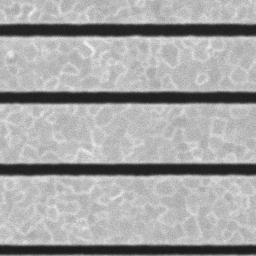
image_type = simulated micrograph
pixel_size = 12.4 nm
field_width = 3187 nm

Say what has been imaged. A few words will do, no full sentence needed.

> lines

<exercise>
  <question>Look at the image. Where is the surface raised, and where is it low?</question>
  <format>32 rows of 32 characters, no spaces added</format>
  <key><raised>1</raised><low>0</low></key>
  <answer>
11111111111111111111111111111111
11111111111111111111111111111111
11111111111111111111111111111111
00000000000000000000000000000000
00000000000000000000000000000000
11111111111111111111111111111111
11111111111111111111111111111111
11111111111111111111111111111111
11111111111111111111111111111111
11111111111111111111111111111111
11111111111111111111111111111111
00000000000000000000000000000000
00000000000000000000000000000000
11111111111111111111111111111111
11111111111111111111111111111111
11111111111111111111111111111111
11111111111111111111111111111111
11111111111111111111111111111111
11111111111111111111111111111111
11111111111111111111111111111111
00000000000000000000000000000000
00000000000000000000000000000000
11111111111111111111111111111111
11111111111111111111111111111111
11111111111111111111111111111111
11111111111111111111111111111111
11111111111111111111111111111111
11111111111111111111111111111111
11111111111111111111111111111111
11111111111111111111111111111111
11111111111111111111111111111111
00000000000000000000000000000000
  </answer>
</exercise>